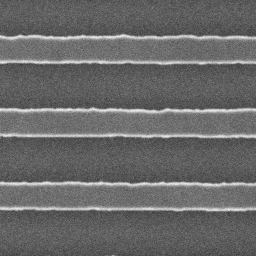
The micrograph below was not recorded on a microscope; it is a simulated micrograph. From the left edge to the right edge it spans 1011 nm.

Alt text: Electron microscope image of lines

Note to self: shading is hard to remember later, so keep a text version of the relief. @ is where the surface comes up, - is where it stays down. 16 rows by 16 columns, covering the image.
----------------
----------------
@@@@@@@@@@@@@@@@
@@@@@@@@@@@@@@@@
----------------
----------------
----------------
@@@@@@@@@@@@@@@@
@@@@@@@@@@@@@@@@
----------------
----------------
@@@@@@@@@@@@@@@@
@@@@@@@@@@@@@@@@
----------------
----------------
----------------